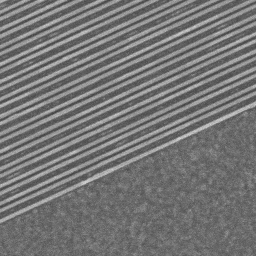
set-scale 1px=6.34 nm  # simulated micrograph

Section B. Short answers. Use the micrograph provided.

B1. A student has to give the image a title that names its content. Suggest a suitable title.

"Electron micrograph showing parallel lines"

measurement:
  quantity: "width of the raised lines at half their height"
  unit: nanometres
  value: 20.9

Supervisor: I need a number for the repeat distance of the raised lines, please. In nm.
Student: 50.5